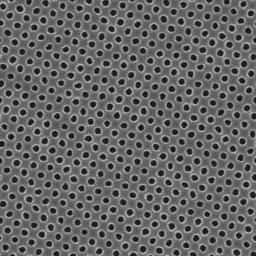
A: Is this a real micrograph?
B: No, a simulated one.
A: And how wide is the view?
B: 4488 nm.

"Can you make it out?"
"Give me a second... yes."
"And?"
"a regular array of holes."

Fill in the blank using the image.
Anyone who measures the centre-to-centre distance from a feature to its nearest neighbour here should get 11.6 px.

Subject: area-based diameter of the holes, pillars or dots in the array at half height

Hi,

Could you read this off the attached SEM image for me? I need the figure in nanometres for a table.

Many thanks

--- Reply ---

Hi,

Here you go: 115